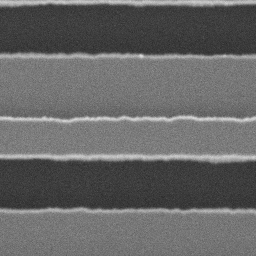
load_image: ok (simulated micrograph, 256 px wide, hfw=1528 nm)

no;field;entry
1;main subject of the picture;lines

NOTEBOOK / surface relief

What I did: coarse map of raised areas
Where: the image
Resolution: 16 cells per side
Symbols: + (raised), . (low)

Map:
................
................
................
+++.+.+++.......
++++++++++++++++
++++++++++++++++
++++++++++++++++
++++++++++++++++
++++++++++++++++
++++++++++++++++
................
................
................
++++++++++++++++
++++++++++++++++
++++++++++++++++